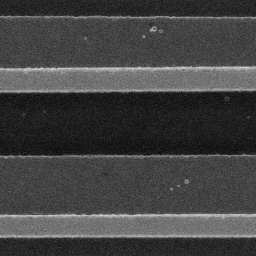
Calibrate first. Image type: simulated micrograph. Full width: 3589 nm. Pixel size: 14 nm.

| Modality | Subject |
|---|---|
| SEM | lines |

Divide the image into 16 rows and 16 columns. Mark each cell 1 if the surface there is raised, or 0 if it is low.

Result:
0000000000000000
1111111111111111
1111111111111111
1111111111111111
1111111111111111
1111111111111111
0000000000000000
0000000000000000
0000000000000000
0000000000000000
1111111111111111
1111111111111111
1111111111111111
1111111111111111
1111111111111111
0000000000000000